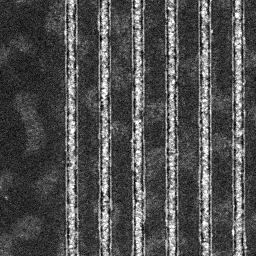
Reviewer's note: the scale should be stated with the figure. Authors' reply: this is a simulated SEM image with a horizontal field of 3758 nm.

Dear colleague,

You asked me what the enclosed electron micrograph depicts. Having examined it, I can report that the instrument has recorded parallel lines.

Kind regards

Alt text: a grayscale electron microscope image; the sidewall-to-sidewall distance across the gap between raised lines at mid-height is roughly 150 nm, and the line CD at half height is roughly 339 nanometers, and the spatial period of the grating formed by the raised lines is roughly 490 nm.